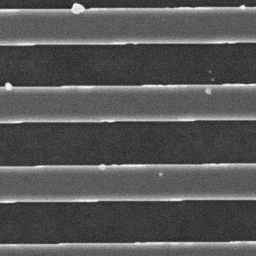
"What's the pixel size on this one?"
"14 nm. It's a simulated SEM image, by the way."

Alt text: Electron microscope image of lines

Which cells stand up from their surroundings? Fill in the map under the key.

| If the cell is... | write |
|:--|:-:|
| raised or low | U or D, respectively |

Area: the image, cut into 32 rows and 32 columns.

DDDDDDDDDDDDDDDDDDDDDDDDDDDDDDDD
UUUUUUUUUUUUUUUUUUUUUUUUUUUUUUUU
UUUUUUUUUUUUUUUUUUUUUUUUUUUUUUUU
UUUUUUUUUUUUUUUUUUUUUUUUUUUUUUUU
UUUUUUUUUUUUUUUUUUUUUUUUUUUUUUUU
UUUUUDDDDDDDDDDDDDDDDDDDDDDDDDDD
DDDDDDDDDDDDDDDDDDDDDDDDDDDDDDDD
DDDDDDDDDDDDDDDDDDDDDDDDDDDDDDDD
DDDDDDDDDDDDDDDDDDDDDDDDDDDDDDDD
DDDDDDDDDDDDDDDDDDDDDDDDDDDDDDDD
DDDDDDDDDDDDDDDDDDDDDDDDDDDDDDDD
UUUUUUUUUUUUUUUUUUUUUUUUUUUUUUUU
UUUUUUUUUUUUUUUUUUUUUUUUUUUUUUUU
UUUUUUUUUUUUUUUUUUUUUUUUUUUUUUUU
UUUUUUUUUUUUUUUUUUUUUUUUUUUUUUUU
DDDDDDDDDDDDDDDDDDDDDDDDDDDDDDDD
DDDDDDDDDDDDDDDDDDDDDDDDDDDDDDDD
DDDDDDDDDDDDDDDDDDDDDDDDDDDDDDDD
DDDDDDDDDDDDDDDDDDDDDDDDDDDDDDDD
DDDDDDDDDDDDDDDDDDDDDDDDDDDDDDDD
DDDDDDDDDDDDDDDDDDDDDDDDDDDDDDDD
UUUUUUUUUUUUUUUUUUUUUUUUUUUUUUUU
UUUUUUUUUUUUUUUUUUUUUUUUUUUUUUUU
UUUUUUUUUUUUUUUUUUUUUUUUUUUUUUUU
UUUUUUUUUUUUUUUUUUUUUUUUUUUUUUUU
DDDDDDDDDDDDDDDDDDDDDDDDDDDDDDDD
DDDDDDDDDDDDDDDDDDDDDDDDDDDDDDDD
DDDDDDDDDDDDDDDDDDDDDDDDDDDDDDDD
DDDDDDDDDDDDDDDDDDDDDDDDDDDDDDDD
DDDDDDDDDDDDDDDDDDDDDDDDDDDDDDDD
DDDDDDDUUUUUUUUUUUUUUUUUUUUUUUUU
UUUUUUUUUUUUUUUUUUUUUUUUUUUUUUUU